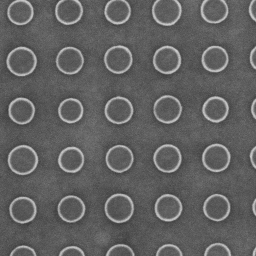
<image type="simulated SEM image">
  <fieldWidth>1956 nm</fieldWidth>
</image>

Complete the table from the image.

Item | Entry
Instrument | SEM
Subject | a regular array of raised bodies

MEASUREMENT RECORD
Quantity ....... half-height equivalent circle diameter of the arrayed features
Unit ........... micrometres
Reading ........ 0.2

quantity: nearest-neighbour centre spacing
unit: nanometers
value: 369